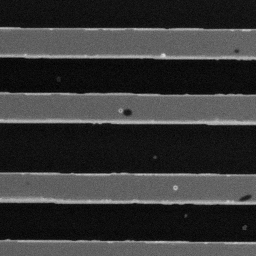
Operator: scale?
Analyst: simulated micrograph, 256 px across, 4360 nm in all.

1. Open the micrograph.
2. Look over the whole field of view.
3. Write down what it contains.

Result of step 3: lines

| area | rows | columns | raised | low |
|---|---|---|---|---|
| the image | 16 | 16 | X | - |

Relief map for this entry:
----------------
----------------
XXXXXXXXXXXXXXXX
XXXXXXXXXXXXXXXX
----------------
----------------
XXXXXXXXXXXXXXXX
XXXXXXXXXXXXXXXX
----------------
----------------
----------------
XXXXXXXXXXXXXXXX
XXXXXXXXXXXXXXXX
----------------
----------------
XXXXXXXXXXXXXXXX